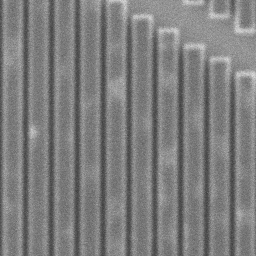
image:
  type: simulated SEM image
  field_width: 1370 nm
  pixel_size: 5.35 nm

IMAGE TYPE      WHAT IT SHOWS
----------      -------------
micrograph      parallel lines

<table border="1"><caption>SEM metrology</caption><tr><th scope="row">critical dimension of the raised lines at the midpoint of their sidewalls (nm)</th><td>98.9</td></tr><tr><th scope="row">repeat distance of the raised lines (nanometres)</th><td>138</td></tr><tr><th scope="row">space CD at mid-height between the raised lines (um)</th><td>0.0381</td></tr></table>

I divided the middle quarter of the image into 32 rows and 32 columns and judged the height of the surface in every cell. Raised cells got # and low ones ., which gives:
##..#####..####..#####..####..##
##..#####..####..#####..####..##
##..#####..####..#####..####..##
##..#####..####..#####..####..##
##..#####..####..#####..####..##
##..#####..####..#####..####..##
##..#####..####..#####..####..##
##..#####..####..#####..####..##
##..#####..####..#####..####..##
##..#####..####..#####..####..##
##..#####..####..#####..####..##
##..#####..####..#####..####..##
##..#####..####..#####..####..##
##..#####..####..#####..####..##
##..#####..####..#####..####..##
##..#####..####..#####..####..##
##..#####..####..#####..####..##
##..#####..####..#####..####..##
##..#####..####..#####..####..##
##..#####..####..#####..####..##
##..#####..####..#####..####..##
##..#####..####..#####..####..##
##..#####..####..#####..####..##
##..#####..####..#####..####..##
##..#####..####..#####..####..##
##..#####..####..#####..####..##
##..#####..####..#####..####..##
##..#####..####..#####..####..##
##..#####..####..#####..####..##
##..#####..####..#####..####..##
##..#####..####..#####..####..##
##..#####..####..#####..####..##